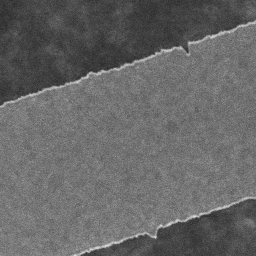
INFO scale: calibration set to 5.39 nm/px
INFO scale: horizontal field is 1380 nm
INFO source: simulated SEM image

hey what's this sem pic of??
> one or a few lines or trenches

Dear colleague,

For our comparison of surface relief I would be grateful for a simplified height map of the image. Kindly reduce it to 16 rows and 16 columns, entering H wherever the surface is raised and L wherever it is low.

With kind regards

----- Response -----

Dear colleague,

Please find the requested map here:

LLLLLLLLLLLLLLLL
LLLLLLLLLLLLLLLL
LLLLLLLLLLLLLHHH
LLLLLLLLLLHHHHHH
LLLLLLLHHHHHHHHH
LLLHHHHHHHHHHHHH
HHHHHHHHHHHHHHHH
HHHHHHHHHHHHHHHH
HHHHHHHHHHHHHHHH
HHHHHHHHHHHHHHHH
HHHHHHHHHHHHHHHH
HHHHHHHHHHHHHHHH
HHHHHHHHHHHHHHHL
HHHHHHHHHHHHLLLL
HHHHHHHHHHLLLLLL
HHHHHHLLLLLLLLLL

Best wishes